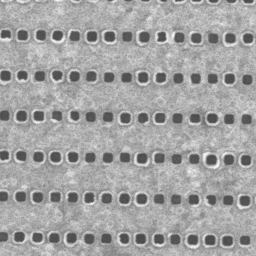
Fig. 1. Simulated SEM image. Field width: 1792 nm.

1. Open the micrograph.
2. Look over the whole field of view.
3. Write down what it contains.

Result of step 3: a regular array of holes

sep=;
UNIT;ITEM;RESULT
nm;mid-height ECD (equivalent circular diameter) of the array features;78.5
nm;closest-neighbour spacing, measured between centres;119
